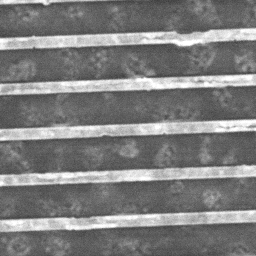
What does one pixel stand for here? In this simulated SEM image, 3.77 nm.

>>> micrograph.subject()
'parallel lines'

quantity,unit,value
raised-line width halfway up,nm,39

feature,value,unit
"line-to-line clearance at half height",131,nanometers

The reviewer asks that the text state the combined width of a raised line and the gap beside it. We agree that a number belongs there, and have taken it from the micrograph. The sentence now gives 171 nm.